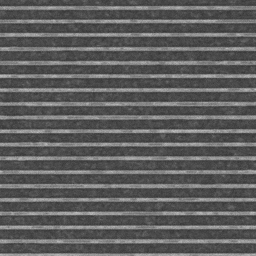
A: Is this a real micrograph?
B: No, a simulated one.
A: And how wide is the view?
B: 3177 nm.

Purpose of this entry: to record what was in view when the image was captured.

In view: parallel lines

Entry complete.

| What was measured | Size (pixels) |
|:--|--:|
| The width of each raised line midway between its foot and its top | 3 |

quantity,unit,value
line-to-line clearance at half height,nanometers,138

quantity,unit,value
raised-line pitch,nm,170